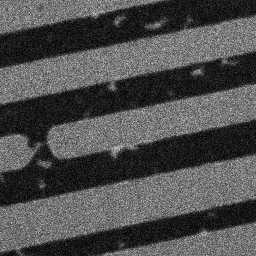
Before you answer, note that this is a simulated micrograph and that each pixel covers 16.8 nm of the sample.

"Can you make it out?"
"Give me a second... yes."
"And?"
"one or a few lines or trenches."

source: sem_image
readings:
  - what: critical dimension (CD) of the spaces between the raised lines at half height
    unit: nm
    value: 549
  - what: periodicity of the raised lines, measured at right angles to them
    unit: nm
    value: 1130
